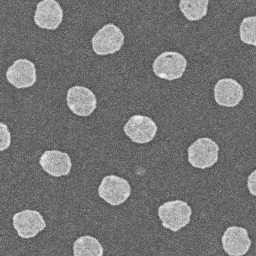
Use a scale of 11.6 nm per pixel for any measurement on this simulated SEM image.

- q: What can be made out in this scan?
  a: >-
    a regular array of raised bodies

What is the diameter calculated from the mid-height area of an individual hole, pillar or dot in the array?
328 nm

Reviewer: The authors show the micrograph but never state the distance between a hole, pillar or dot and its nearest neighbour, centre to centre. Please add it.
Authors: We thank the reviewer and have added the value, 0.758 microns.